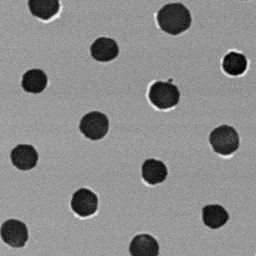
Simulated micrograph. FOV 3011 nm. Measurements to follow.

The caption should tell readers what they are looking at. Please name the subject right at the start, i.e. a regular array of holes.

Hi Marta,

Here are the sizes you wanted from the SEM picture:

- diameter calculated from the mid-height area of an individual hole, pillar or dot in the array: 331 nm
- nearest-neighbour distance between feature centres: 885 nanometers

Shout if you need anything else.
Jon